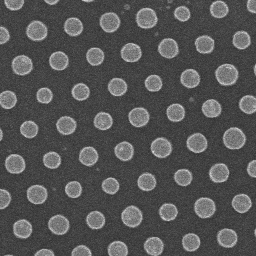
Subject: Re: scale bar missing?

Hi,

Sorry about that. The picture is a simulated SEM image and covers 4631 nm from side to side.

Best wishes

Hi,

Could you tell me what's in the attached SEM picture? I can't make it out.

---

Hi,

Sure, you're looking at a regular array of raised bodies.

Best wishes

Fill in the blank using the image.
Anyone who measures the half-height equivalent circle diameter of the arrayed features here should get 18.7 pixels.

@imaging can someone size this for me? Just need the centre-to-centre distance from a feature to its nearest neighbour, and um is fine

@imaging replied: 0.658